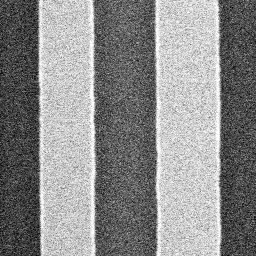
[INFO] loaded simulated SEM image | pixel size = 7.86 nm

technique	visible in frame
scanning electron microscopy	lines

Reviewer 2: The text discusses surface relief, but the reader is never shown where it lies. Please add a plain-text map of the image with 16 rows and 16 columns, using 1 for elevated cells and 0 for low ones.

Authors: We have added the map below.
0001110000111100
0001110000111100
0001110000111100
0001110000111100
0001110000111100
0001110000111100
0001110000111100
0001110000111100
0001110000111100
0001110000111100
0001110000111100
0001110000111100
0001110000111100
0001110000111100
0001110000111100
0001110000111100